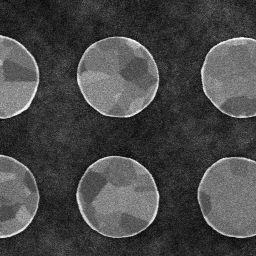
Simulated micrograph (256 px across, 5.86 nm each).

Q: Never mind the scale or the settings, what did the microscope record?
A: raised bodies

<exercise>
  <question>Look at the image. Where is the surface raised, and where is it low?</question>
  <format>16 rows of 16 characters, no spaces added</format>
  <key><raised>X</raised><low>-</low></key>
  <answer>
----------------
----------------
X-----XX------XX
XX---XXXX----XXX
XX---XXXXX---XXX
XX---XXXXX---XXX
XX----XXX----XXX
----------------
----------------
----------------
XX----XXX----XXX
XX---XXXXX---XXX
XX---XXXXX--XXXX
XX---XXXXX---XXX
X-----XXX-----XX
----------------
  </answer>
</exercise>